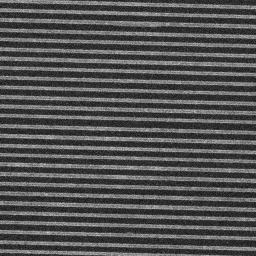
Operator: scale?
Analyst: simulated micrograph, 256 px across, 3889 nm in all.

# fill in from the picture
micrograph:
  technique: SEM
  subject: parallel lines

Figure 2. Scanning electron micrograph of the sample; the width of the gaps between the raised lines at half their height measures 101 nm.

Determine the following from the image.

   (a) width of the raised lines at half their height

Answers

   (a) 43.7 nanometres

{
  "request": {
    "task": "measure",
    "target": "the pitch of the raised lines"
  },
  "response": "146 nm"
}